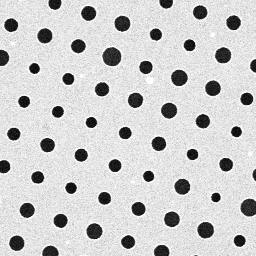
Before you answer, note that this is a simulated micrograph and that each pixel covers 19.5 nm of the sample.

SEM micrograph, a regular array of holes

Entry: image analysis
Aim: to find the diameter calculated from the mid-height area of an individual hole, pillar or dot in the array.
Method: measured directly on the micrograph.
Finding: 278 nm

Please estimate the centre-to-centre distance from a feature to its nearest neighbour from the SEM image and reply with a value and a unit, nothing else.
670 nm